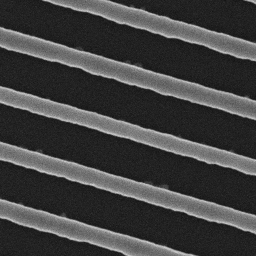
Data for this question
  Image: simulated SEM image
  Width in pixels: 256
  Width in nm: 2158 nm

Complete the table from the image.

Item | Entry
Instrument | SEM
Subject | lines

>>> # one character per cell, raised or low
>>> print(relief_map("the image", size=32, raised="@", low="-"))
-------@@@@@@@@-----------------
-----------@@@@@@@--------------
--------------@@@@@@@@----------
-----------------@@@@@@@@-------
@@@@-----------------@@@@@@@@---
@@@@@@@------------------@@@@@@@
--@@@@@@@@@-----------------@@@@
------@@@@@@@@-----------------@
----------@@@@@@@@--------------
-------------@@@@@@@@-----------
----------------@@@@@@@@@-------
@@@-----------------@@@@@@@@----
@@@@@@-----------------@@@@@@@@@
--@@@@@@@@-----------------@@@@@
------@@@@@@@-----------------@@
---------@@@@@@@----------------
-------------@@@@@@@------------
-----------------@@@@@@---------
@@@-----------------@@@@@@@-----
@@@@@@-----------------@@@@@@@--
--@@@@@@@@-----------------@@@@@
-----@@@@@@@@-----------------@@
---------@@@@@@@----------------
------------@@@@@@@@------------
----------------@@@@@@@@--------
@@-----------------@@@@@@@@-----
@@@@@@-----------------@@@@@@@--
-@@@@@@@@-----------------@@@@@@
----@@@@@@@@------------------@@
--------@@@@@@@@----------------
------------@@@@@@@-------------
---------------@@@@@@@@---------